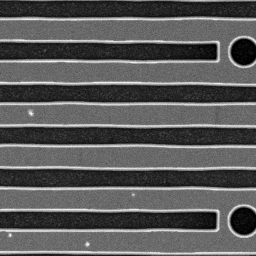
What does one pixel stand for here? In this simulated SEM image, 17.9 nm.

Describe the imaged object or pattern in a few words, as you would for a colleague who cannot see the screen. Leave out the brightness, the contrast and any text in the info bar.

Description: groups of lines, slits or small figures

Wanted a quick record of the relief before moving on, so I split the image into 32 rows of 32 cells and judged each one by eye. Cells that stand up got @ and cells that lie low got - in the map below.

--------------------------------
--------------------------------
@@@@@@@@@@@@@@@@@@@@@@@@@@@@@@@@
@@@@@@@@@@@@@@@@@@@@@@@@@@@@@@@@
@@@@@@@@@@@@@@@@@@@@@@@@@@@@@@@@
---------------------------@@---
---------------------------@@---
---------------------------@@---
@@@@@@@@@@@@@@@@@@@@@@@@@@@@@@@@
@@@@@@@@@@@@@@@@@@@@@@@@@@@@@@@@
--------@@----------------@@@@@@
--------------------------------
--------------------------------
@@@@@@@@@@@@@@@@@@@@@@@@@@@@@@@@
@@@@@@@@@@@@@@@@@@@@@@@@@@@@@@@@
@@@@@@@@@@@@@@@@@@@@@@@@@@@@@@@@
--------------------------------
--------------------------------
@@@@@@@@@@@@@@@@@@@@@@@@@@@@@@@@
@@@@@@@@@@@@@@@@@@@@@@@@@@@@@@@@
@@@@@@@@@@@@@@@@@@@@@@@@@@@@@@@@
--------------------------------
--------------------------------
@@@---------@@@@@@@---@@@@------
@@@@@@@@@@@@@@@@@@@@@@@@@@@@@@@@
@@@@@@@@@@@@@@@@@@@@@@@@@@@@@@@@
---------------------------@@---
---------------------------@@---
---------------------------@@---
@@@@@@@@@@@@@@@@@@@@@@@@@@@@@@-@
@@@@@@@@@@@@@@@@@@@@@@@@@@@@@@@@
@@@@@--@@@@@@@@@@@@@@@@@@@@@@@@@